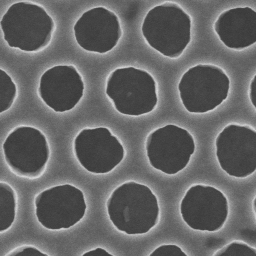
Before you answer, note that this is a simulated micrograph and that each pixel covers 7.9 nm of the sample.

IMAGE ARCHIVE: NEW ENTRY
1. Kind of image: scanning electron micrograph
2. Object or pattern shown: a regular array of holes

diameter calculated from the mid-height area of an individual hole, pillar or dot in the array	371	nm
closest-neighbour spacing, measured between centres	0.537	um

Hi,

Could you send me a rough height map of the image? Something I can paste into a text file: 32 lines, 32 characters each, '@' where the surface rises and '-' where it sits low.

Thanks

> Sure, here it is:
@@-@@@@@@@@@@@@@@@@@@@@@@@@@@@@@
@-----@@@@@---@@@@@----@@@@@----
------@@@@-----@@@------@@@-----
------@@@------@@@------@@@-----
------@@@------@@@------@@@-----
@-----@@@@-----@@@@----@@@@@----
@@@@@@@@@@@@-@@@@@@@---@@@@@@@@@
@@@@@@@@@@@@@@@@@@@@@@@@@@@@@@@@
@@@@@@---@@@@@@@-@@@@@@@---@@@@@
-@@@@-----@@@@-----@@@@-----@@@@
--@@@-----@@@------@@@-------@@-
--@@@-----@@@------@@@@------@@-
--@@@-----@@@@------@@@-----@@@-
-@@@@@---@@@@@@----@@@@----@@@@@
@@@@@@@@@@@@@@@@@@@@@@@@@@@@@@@@
@@@@@@@@@@@@@@@@@@@@@@@@@@@@@@@@
@@---@@@@@----@@@@@----@@@@@----
@-----@@@@-----@@@@-----@@@-----
------@@@------@@@------@@@-----
@-----@@@@-----@@@------@@@-----
@-----@@@@-----@@@@----@@@@-----
@@@--@@@@@@@-@@@@@@@--@@@@@@----
@@@@@@@@@@@@@@@@@@@@@@@@@@@@@@@@
-@@@@@@--@@@@@@----@@@@@---@@@@@
--@@@-----@@@@-----@@@@-----@@@@
--@@@------@@-------@@@-----@@@@
--@@@------@@@------@@@-----@@@@
--@@@-----@@@@-----@@@@-----@@@@
-@@@@@--@@@@@@@----@@@@@---@@@@@
@@@@@@@@@@@@@@@@@@@@@@@@@@@@@@@@
@@@@@@@@@@@@@@@@@@@@@@@@@@@@@-@@
@@---@@@@@@--@@@@@@----@@@@@----